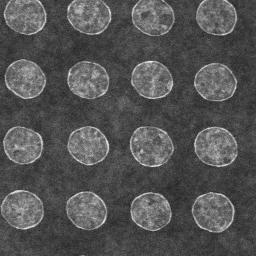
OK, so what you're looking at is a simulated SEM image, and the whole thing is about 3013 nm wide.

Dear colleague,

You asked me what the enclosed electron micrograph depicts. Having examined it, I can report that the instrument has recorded a regular array of raised bodies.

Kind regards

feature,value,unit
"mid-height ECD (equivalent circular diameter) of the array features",39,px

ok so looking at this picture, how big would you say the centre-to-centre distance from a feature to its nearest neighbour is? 746 nanometres